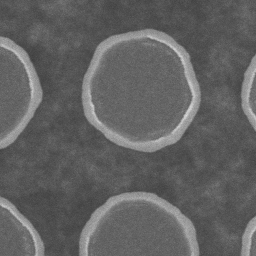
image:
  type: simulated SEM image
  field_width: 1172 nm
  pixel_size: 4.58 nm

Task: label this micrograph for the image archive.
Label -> raised bodies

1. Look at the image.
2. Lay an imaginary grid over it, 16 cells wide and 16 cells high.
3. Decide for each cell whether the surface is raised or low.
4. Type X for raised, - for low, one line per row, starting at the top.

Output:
----------------
----------------
-------XXXX-----
X-----XXXXXX----
XX----XXXXXX----
XX---XXXXXXX---X
XX---XXXXXXX---X
XX----XXXXXX----
X------XXXX-----
----------------
----------------
----------------
-------XXX------
X-----XXXXX-----
XX---XXXXXXX----
XX---XXXXXXX---X